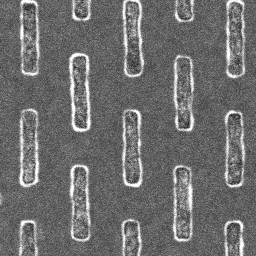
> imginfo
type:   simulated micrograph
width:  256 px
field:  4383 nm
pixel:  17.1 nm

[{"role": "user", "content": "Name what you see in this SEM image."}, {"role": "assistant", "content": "a regular array of holes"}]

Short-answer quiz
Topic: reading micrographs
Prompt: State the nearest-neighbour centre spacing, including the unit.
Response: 1280 nm